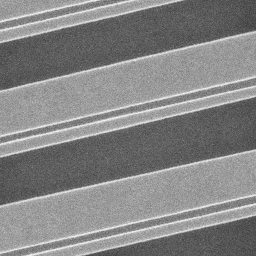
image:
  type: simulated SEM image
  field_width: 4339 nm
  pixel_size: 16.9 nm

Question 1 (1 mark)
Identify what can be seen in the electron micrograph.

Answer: lines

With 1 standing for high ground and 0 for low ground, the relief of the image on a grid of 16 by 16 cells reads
1111111110000000
1111100000000000
1000000000000011
0000000000111111
0000011111111111
0111111111111111
1111111111111100
1111111111000000
1111110000000000
1000000000000001
0000000000011111
0000001111111111
0011111111111111
1111111111111111
1111111111100000
1111111000000000